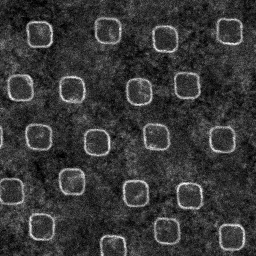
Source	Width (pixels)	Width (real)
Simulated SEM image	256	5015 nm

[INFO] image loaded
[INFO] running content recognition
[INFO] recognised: a regular array of raised bodies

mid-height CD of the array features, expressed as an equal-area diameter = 0.522 micrometres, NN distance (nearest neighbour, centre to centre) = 1010 nm